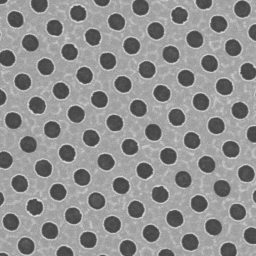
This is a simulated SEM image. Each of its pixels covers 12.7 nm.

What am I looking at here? a regular array of holes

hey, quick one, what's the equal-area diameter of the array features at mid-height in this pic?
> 0.217 µm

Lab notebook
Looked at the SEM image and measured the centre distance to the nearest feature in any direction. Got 353 nm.